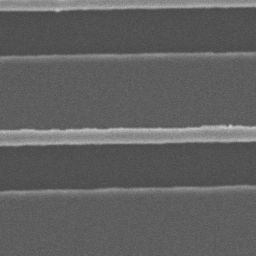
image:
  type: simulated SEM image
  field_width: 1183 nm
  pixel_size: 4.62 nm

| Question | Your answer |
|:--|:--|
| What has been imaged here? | lines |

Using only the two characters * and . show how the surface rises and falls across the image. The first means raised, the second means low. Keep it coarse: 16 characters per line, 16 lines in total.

********........
................
................
.....***********
****************
****************
****************
****************
****************
................
................
................
****************
****************
****************
****************